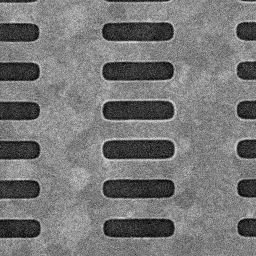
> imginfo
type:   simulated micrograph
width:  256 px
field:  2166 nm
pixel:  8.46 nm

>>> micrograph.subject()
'groups of lines, slits or small figures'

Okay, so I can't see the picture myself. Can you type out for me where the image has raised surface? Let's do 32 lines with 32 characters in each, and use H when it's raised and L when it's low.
HHHHHHHHHHHHHHHHHHHHHHHHHHHHHHHH
HHHHHHHHHHHHHHHHHHHHHHHHHHHHHHHH
HHHHHHHHHHHHHHHHHHHHHHHHHHHHHHHH
LLLLLHHHHHHHHLLLLLLLLLHHHHHHHLLL
LLLLLHHHHHHHHLLLLLLLLLHHHHHHHHLL
HHHHHHHHHHHHHHHHHHHHHHHHHHHHHHHH
HHHHHHHHHHHHHHHHHHHHHHHHHHHHHHHH
HHHHHHHHHHHHHHHHHHHHHHHHHHHHHHHH
LLLLLHHHHHHHHLLLLLLLLLHHHHHHHHLL
LLLLLHHHHHHHHLLLLLLLLLHHHHHHHHLL
HHHHHHHHHHHHHHHHHHHHHHHHHHHHHHHH
HHHHHHHHHHHHHHHHHHHHHHHHHHHHHHHH
HHHHHHHHHHHHHHHHLLLLHHHHHHHHHHHH
LLLLLHHHHHHHHLLLLLLLLLHHHHHHHHLL
LLLLLHHHHHHHHLLLLLLLLLHHHHHHHHLL
HHHHHHHHHHHHHHHHHHHHHHHHHHHHHHHH
HHHHHHHHHHHHHHHHHHHHHHHHHHHHHHHH
LLLLHHHHHHHHHHLLLLLLLHHHHHHHHHLL
LLLLLHHHHHHHHLLLLLLLLLHHHHHHHHLL
LLLLLHHHHHHHHLLLLLLLLLHHHHHHHHLL
HHHHHHHHHHHHHHHHHHHHHHHHHHHHHHHH
HHHHHHHHHHHHHHHHHHHHHHHHHHHHHHHH
LLLLHHHHHHHHHLLLLLLLLHHHHHHHHHLL
LLLLLHHHHHHHHLLLLLLLLLHHHHHHHHLL
LLLLLHHHHHHHHLLLLLLLLLHHHHHHHHLL
HHHHHHHHHHHHHHHHHHHHHHHHHHHHHHHH
HHHHHHHHHHHHHHHHHHHHHHHHHHHHHHHH
LLLLLHHHHHHHHLLLLLLLLHHHHHHHHHLL
LLLLLHHHHHHHHLLLLLLLLLHHHHHHHHLL
LLLLLHHHHHHHHLLLLLLLLHHHHHHHHHLL
HHHHHHHHHHHHHHHHHHHHHHHHHHHHHHHH
HHHHHHHHHHHHHHHHHHHHHHHHHHHHHHHH